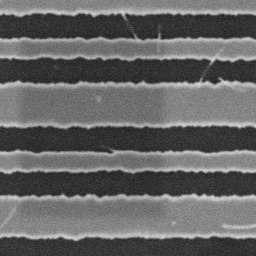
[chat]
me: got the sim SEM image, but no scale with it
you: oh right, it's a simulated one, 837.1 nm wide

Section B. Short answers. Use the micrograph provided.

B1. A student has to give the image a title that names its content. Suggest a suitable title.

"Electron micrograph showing lines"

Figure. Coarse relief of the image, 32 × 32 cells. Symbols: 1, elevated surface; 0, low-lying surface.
11111111111111111111111111111111
11111111111111111111111111111111
00000000000000000000000000000000
00000000000000000000000000000000
00000000000000000000000000000000
11111111111111111111111111111111
11111111111111111111111111111111
00000000000000000000000000101100
00000000000000000000000000000000
00000000000000000000000000000000
11111111111111111111111111111111
11111111111111111111111111111111
11111111111111111111111111111111
11111111111111111111111111111111
11111111111111111111111111111111
11111111111111111111111111111111
00000000000000000000000000000000
00000000000000000000000000000000
00000000000000000000000000000000
11111111111111111111111111111111
11111111111111111111111111111111
11010000011000001000000000000011
00000000000000000000000000000000
00000000000000000000000000000000
00000001000100110010100111000101
11111111111111111111111111111111
11111111111111111111111111111111
11111111111111111111111111111111
11111111111111111111111111111111
11111111111111111111111111111111
00000000000000000000000000000000
00000000000000000000000000000000